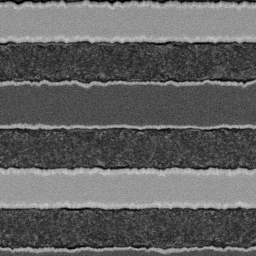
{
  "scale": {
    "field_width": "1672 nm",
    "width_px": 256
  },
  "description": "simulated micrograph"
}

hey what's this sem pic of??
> lines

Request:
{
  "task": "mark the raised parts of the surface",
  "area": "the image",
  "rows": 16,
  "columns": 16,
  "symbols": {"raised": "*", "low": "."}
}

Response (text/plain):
****************
****************
****************
................
................
****************
****************
****************
................
................
................
****************
****************
................
................
.*...*.**...****